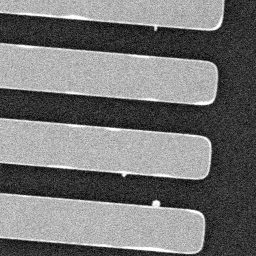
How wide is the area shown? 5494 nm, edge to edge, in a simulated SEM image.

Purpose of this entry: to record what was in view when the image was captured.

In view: groups of lines, slits or small figures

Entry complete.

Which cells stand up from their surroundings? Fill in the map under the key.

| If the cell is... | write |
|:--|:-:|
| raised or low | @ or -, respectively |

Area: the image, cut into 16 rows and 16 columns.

@@@@@@@@@@@@@@--
--------@@@@@@--
----------------
@@@@@@@@@-------
@@@@@@@@@@@@@@--
@@@@@@@@@@@@@@--
----------------
@---------------
@@@@@@@@@@@@----
@@@@@@@@@@@@@---
----@@@@@@@@@---
----------------
@@@@@-----------
@@@@@@@@@@@@@---
@@@@@@@@@@@@@---
--------@@@@----